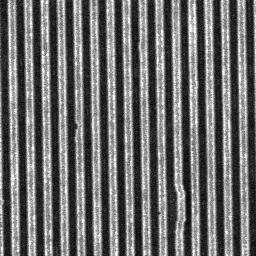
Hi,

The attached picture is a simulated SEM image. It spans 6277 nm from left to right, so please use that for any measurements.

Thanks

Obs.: parallel lines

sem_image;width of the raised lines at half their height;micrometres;0.196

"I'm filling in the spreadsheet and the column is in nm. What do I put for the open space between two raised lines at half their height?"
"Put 218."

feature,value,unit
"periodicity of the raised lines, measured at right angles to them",402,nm